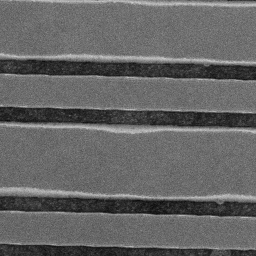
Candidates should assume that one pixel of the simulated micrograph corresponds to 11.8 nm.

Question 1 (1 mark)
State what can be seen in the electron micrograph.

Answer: lines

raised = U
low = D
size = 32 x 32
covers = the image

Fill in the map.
UUUUUUUUUUUUUUUUUUUUUUUUUUUUUUUU
UUUUUUUUUUUUUUUUUUUUUUUUUUUUUUUU
UUUUUUUUUUUUUUUUUUUUUUUUUUUUUUUU
UUUUUUUUUUUUUUUUUUUUUUUUUUUUUUUU
UUUUUUUUUUUUUUUUUUUUUUUUUUUUUUUU
UUUUUUUUUUUUUUUUUUUUUUUUUUUUUUUU
UUUUUUUUUUUUUUUUUUUUUUUUUUUUUUUU
DDDDDDDDDDDDDDDDDUUUUUUUUUUUUUUU
DDDDDDDDDDDDDDDDDDDDDDDDDDDDDDDD
UUUUUUDDDDDDDDDDDDDDDDDDDDDDDDDD
UUUUUUUUUUUUUUUUUUUUUUUUUUUUUUUU
UUUUUUUUUUUUUUUUUUUUUUUUUUUUUUUU
UUUUUUUUUUUUUUUUUUUUUUUUUUUUUUUU
DDDDDDDDDDDUUUUUUUUUUUUUUUUUUUUU
DDDDDDDDDDDDDDDDDDDDDDDDDDDDDDDD
UUDDDDDDDDDDDDDDDDDDDDDDDDDDDDDD
UUUUUUUUUUUUUUUUUUUUUUUUUUUUUUUU
UUUUUUUUUUUUUUUUUUUUUUUUUUUUUUUU
UUUUUUUUUUUUUUUUUUUUUUUUUUUUUUUU
UUUUUUUUUUUUUUUUUUUUUUUUUUUUUUUU
UUUUUUUUUUUUUUUUUUUUUUUUUUUUUUUU
UUUUUUUUUUUUUUUUUUUUUUUUUUUUUUUU
UUUUUUUUUUUUUUUUUUUUUUUUUUUUUUUU
UUUUUUUUUUUUUUUUUUUUUUUUUUUUUUUU
DDDDDDDDDDUUUUUUUUUUUUUUUUUUUUUU
DDDDDDDDDDDDDDDDDDDDDDDDDDDDDDDD
UUUDDDDDDDDDDDDDDDDDDDDDDDDDDDDD
UUUUUUUUUUUUUUUUUUUUUUUUUUUUUUUU
UUUUUUUUUUUUUUUUUUUUUUUUUUUUUUUU
UUUUUUUUUUUUUUUUUUUUUUUUUUUUUUUU
DUUUUUUUUUUUUUUUUUUUUUUUUUUUUUUU
DDDDDDDDDDDDDDDDDDDDDDDDDDDDDDDD